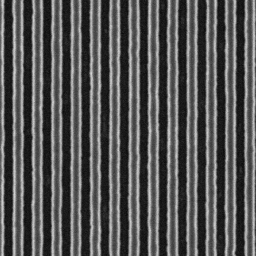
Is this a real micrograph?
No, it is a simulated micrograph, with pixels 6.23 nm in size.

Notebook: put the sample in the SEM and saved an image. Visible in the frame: parallel lines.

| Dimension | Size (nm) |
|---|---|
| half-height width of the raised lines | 53.8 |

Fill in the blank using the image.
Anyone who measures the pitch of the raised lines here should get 120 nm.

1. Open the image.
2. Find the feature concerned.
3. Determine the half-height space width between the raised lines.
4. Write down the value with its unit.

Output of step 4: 10.5 pixels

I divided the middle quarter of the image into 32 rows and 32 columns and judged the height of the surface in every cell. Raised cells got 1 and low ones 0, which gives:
00110001100011000110011000110001
00110001100011000110011000110001
00110001100011000110011000110001
00110001100011001110011000110001
00110001100011001110011000110001
00110001100011001110011000110001
00110001100011000110011000110001
00110001100011000110011000110001
00110001100011001110011000110001
00110001100011001110011000110001
00110001100011001110011000110001
00110001100011001110011000110001
00110001100011001110011000110001
00110001100011001110011000110001
00110001100011001110011000110001
00110001100011001110011000110001
00110001100011001110011000110001
00110001100011001110011000110001
00110001100011000110011100110001
00110001100011001110011000110001
00110001100011001100011000110001
00110001100011001100011000110001
00110001100011001110011000110001
00110001100011001110011000110001
00110001100011001110011000110001
00110001100011001110011000110001
00110001100011001110011000110001
00110001100011001110011000110001
00110001100011001100011000110001
00110001100011001110011000110001
00110001100011001110011000110001
00110001100011001110011000110001